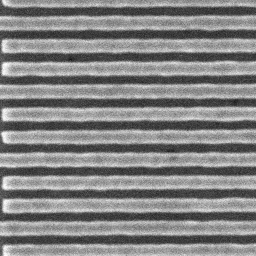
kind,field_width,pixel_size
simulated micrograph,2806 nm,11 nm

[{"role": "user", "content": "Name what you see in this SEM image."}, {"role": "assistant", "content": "wiring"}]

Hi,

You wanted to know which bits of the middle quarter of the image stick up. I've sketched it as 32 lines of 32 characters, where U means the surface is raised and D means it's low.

UUUUUUUUUUUUUUUUUUUUUUUUUUUUUUUU
UUUUUUUUUUUUUUUUUUUUUUUUUUUUUUUU
UUUUUUUUUUUUUUUUUUUUUUUUUUUUUUUU
DDDDDDDDDDDDDDDDDDDDDDDDDDDDDDDD
DDDDDDDDDDDDDDDDDDDDDDDDDDDDDDDD
DDDDDUUUUDUUUUUUUUUDDUUUUDUUUUUU
UUUUUUUUUUUUUUUUUUUUUUUUUUUUUUUU
UUUUUUUUUUUUUUUUUUUUUUUUUUUUUUUU
DDDDDDDDUUUUUDDDDDDDDDDDDDDDDDDD
DDDDDDDDDDDDDDDDDDDDDDDDDDDDDDDD
DDDDDDDDDDDDDDDDDDDDDDDDDDDDDDDD
UUUUUUUUUUUUUUUUUUUUUUUUUUUUUUUU
UUUUUUUUUUUUUUUUUUUUUUUUUUUUUUUU
UUUUUUUUUUUUUUUUUUUUUUUUUUUUUUUU
DDDDDDDDDDDDDDDDDDDDDDDDDDDDDDDD
DDDDDDDDDDDDDDDDDDDDDDDDDDDDDDDD
DDDDDDDDDDDDDDDDDDDDDDDDDDDDDDDD
UUUUUUUUUUUUUUUUUUUUUUUUUUUUUUUU
UUUUUUUUUUUUUUUUUUUUUUUUUUUUUUUU
UUUUUUUUUUUUUUUUUUUUUUUUUUUUUUUU
DDDDDDDDDDDDDDDDDDDDDDDDDDDDDDDD
DDDDDDDDDDDDDDDDDDDDDDDDDDDDDDDD
UUUDDDUUUUUUUDUUUUUUUUUUDDUUDUUU
UUUUUUUUUUUUUUUUUUUUUUUUUUUUUUUU
UUUUUUUUUUUUUUUUUUUUUUUUUUUUUUUU
DDDDDDDDDDDDDDUUDDDDDUUUDDDDDDDD
DDDDDDDDDDDDDDDDDDDDDDDDDDDDDDDD
DDDDDDDDDDDDDDDDDDDDDDDDDDDDDDDD
UUUUUUUUUUUUUUUUUUUUUUUUUUUUUUUU
UUUUUUUUUUUUUUUUUUUUUUUUUUUUUUUU
UUUUUUUUUUUUUUUUUUUUUUUUUUUUUUUU
DDDDDDDDDDDDDDDDDDDDDDDDDDDDDDDD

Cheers